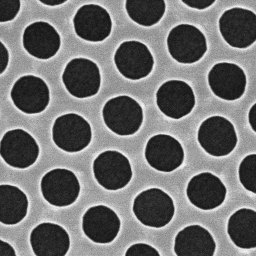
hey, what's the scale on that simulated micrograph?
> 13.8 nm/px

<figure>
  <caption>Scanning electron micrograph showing a regular array of holes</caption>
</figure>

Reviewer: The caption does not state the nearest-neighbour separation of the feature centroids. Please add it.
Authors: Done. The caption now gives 54.9 px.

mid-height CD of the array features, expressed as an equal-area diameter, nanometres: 533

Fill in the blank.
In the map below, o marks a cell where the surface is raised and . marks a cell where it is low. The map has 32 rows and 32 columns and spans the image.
...ooo..oooooooo.....oo...oooooo
..oooooooo...ooo.....ooooooo...o
.oooooooo.....ooo...ooooooo.....
ooo....oo.....oooooooo...oo.....
ooo....ooo...oooooooo....ooo....
ooo.....ooooooo...ooo.....ooo..o
.ooo...oooooooo....oo.....oooooo
.oooooooo..ooo.....ooo...ooooooo
.ooooooo....ooo....oooooooo...oo
ooo.oooo.....ooo..oooooooo.....o
oo....oo....oooooooo...ooo.....o
o.....ooo...oooooooo....ooo...oo
oo....oooooooo...ooo....oooo.ooo
oo....ooooooo.....oo....ooooooo.
oooooooo..ooo.....ooo..oooooooo.
ooooooo....oo.....ooooooo....oo.
o..oooo....ooo...oooooooo....ooo
....ooo....oooooooo...ooo.....oo
.....ooo...ooooooo.....oo....ooo
.....ooooooo....oo.....oooo.ooo.
o...oooooooo....ooo....ooooooo..
oooooo...ooo....oooooooooooooo..
ooooo.....oo....oooooooo...ooo..
..ooo.....ooo..oooooooo.....ooo.
...oo.....ooooooo....oo.....oooo
...ooo...oooooooo.....oo....oooo
...oooooooo...ooo.....ooooooo...
...ooooooo.....oo....oooooooo...
oooo....oo.....oooooooo..ooo....
oooo.....oo...oooooooo....ooo...
.ooo.....oooooooo.oooo.....oo...
..oo....oooooooo....oo.....ooooo